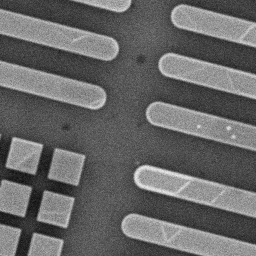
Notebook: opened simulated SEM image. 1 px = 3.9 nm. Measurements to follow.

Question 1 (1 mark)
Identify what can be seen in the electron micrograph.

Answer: groups of lines, slits or small figures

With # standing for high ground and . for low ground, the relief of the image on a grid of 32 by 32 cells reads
...........#####................
#.....................####......
#####.................########..
#########..............#########
.############..............#####
.....##########................#
.........######.................
....................#####.......
###.................########....
#######..............###########
###########..............#######
...##########................###
.......######...................
...................####.........
..................#########.....
...................############.
.......................#########
..#........................#####
.####..........................#
.####..###......................
.####.####......................
...#..####.......#####..........
.......###.......########.......
####..............###########...
####.###..............##########
###..####................#######
.##..####....................###
.....####.......####............
##.............########.........
##..##..........############....
##..####............###########.
##..####................########